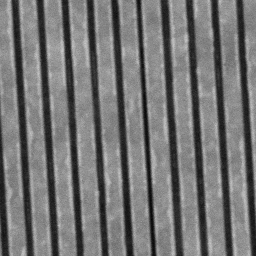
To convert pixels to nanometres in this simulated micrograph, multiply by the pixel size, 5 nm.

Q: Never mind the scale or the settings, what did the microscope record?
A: parallel lines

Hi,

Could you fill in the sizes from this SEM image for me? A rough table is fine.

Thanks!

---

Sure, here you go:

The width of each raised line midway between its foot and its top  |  87.3 nanometers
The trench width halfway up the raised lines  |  0.0337 µm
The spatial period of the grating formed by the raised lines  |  24.8 pixels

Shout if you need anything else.